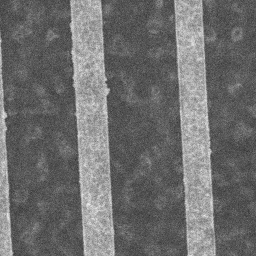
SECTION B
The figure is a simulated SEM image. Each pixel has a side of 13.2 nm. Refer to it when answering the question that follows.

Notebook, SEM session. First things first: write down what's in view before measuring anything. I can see one or a few lines or trenches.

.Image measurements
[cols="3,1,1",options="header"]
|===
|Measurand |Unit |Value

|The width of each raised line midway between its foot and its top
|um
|0.359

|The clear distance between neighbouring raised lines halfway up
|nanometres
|973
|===